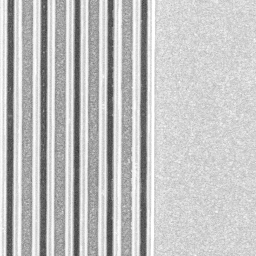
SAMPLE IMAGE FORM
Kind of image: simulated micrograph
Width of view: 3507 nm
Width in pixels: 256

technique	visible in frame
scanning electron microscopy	parallel lines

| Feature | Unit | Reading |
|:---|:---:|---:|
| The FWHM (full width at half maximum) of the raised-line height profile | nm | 89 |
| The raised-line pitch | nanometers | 226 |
